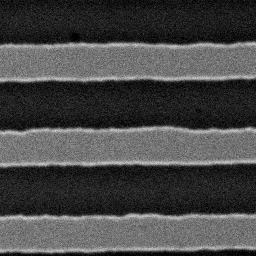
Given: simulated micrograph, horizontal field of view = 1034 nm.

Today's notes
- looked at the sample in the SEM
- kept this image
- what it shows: lines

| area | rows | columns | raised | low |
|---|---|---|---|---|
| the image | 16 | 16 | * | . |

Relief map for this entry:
................
................
................
****************
****************
................
................
................
****************
****************
................
................
................
........**.*****
****************
****************